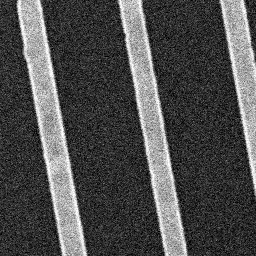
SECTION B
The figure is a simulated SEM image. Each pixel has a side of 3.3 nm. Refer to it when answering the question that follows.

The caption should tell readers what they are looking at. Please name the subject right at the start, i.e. one or a few lines or trenches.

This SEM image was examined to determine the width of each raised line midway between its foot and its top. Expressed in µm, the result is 0.0682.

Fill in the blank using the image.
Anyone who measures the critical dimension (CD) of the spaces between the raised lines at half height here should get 264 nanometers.